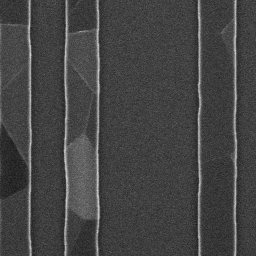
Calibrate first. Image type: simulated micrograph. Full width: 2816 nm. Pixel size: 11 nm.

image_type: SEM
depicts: wiring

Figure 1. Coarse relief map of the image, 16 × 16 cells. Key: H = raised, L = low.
HHLLHHLLLLLLHHHL
HHLLHHLLLLLLHHHL
HHLLHHLLLLLLHHHL
HHLLHHLLLLLLHHHL
HHLLHHLLLLLLHHHL
HHLLHHLLLLLLHHHL
HHLLHHLLLLLLHHHL
HHLLHHLLLLLLHHHL
HHLLHHLLLLLLHHHL
HHLLHHLLLLLLHHHL
HHLLHHLLLLLLHHHL
HHLLHHLLLLLLHHHL
HHLLHHLLLLLLHHHL
HHLLHHLLLLLLHHHL
HHLLHHLLLLLLHHHL
HHLLHHLLLLLLHHHL